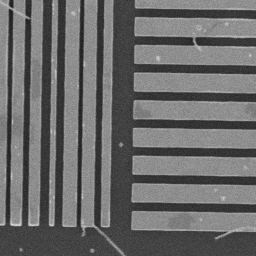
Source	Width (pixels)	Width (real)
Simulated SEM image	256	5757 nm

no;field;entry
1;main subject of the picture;groups of lines, slits or small figures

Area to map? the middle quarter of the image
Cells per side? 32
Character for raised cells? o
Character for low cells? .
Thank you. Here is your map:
oooo.ooo..oo....................
oooo.ooo..oo....................
oooo.ooo..oo......oooooooooooooo
oooo.ooo..oo......oooooooooooooo
oooo.ooo..oo......oooooooooooooo
oooo.ooo..oo......oooooooooooooo
oooo.ooo..oo......oooooooooooooo
oooo.ooo..oo....................
oooo.ooo..oo....................
oooo.ooo..oo......oooooooooooooo
oooo.ooo..oo......oooooooooooooo
ooo..ooo..oo.....ooooooooooooooo
ooo..ooo..oo.....ooooooooooooooo
ooo..ooo..oo.....ooooooooooooooo
ooo..ooo..oo....................
ooo..ooo..oo....................
ooo..ooo..oo.....ooooooooooooooo
ooo..ooo..oo.....ooooooooooooooo
ooo..ooo..oo.....ooooooooooooooo
ooo..ooo..oo.....ooooooooooooooo
ooo..oo...oo......oooooooooooooo
ooo..oo...oo....................
ooo..ooo..oo....................
ooo..ooo..oo.....ooooooooooooooo
ooo..ooo..oo.....ooooooooooooooo
ooo..oo...oo.....ooooooooooooooo
ooo..oo..ooo.....ooooooooooooooo
ooo..oo..ooo........oooooooooooo
ooo..oo..ooo....................
ooo..oo..ooo....................
ooo..oo..oo......ooooooooooooooo
ooo..oo...o......ooooooooooooooo